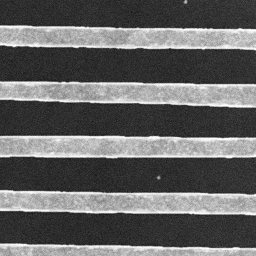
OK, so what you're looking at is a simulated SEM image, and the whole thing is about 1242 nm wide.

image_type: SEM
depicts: lines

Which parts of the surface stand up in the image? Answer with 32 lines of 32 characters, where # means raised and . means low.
................................
................................
................................
##########......................
################################
################################
................................
................................
................................
................................
#################...............
################################
.....###########################
................................
................................
................................
................................
################################
################################
......##########################
................................
................................
................................
................................
################################
################################
.................###############
................................
................................
................................
................................
################################